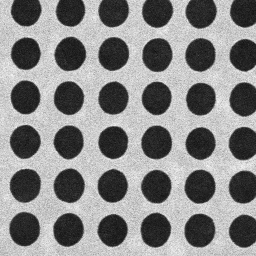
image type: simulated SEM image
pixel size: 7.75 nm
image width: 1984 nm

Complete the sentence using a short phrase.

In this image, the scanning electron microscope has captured a regular array of holes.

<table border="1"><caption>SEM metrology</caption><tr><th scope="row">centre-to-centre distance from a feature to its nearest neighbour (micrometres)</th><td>0.336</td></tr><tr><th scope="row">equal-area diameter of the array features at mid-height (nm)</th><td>248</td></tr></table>